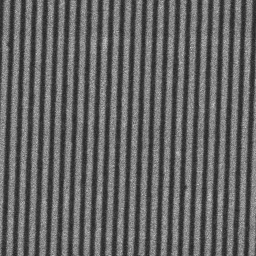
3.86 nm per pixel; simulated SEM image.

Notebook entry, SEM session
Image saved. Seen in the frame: parallel lines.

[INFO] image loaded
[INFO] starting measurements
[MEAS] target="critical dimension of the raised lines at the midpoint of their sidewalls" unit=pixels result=5.49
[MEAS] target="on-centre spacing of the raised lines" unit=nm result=42.5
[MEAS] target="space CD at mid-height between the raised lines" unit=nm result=21.2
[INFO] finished